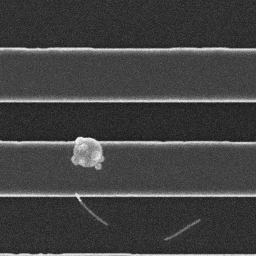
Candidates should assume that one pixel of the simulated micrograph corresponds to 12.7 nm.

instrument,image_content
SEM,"lines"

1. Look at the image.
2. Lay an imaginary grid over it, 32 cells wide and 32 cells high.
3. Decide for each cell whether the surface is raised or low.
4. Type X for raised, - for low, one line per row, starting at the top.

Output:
--------------------------------
--------------------------------
--------------------------------
--------------------------------
--------------------------------
--------------------------------
XXXXXXXXXXXXXXXXXXXXXXXXXXXXXXXX
XXXXXXXXXXXXXXXXXXXXXXXXXXXXXXXX
XXXXXXXXXXXXXXXXXXXXXXXXXXXXXXXX
XXXXXXXXXXXXXXXXXXXXXXXXXXXXXXXX
XXXXXXXXXXXXXXXXXXXXXXXXXXXXXXXX
XXXXXXXXXXXXXXXXXXXXXXXXXXXXXXXX
XXXXXXXXXXXXXXXXXXXXXXXXXXXXXXXX
--------------------------------
--------------------------------
--------------------------------
--------------------------------
---------XXX--------------------
XXXXXXXXXXXXXXXXXXXXXXXXXXXXXXXX
XXXXXXXXXXXXXXXXXXXXXXXXXXXXXXXX
XXXXXXXXXXXXXXXXXXXXXXXXXXXXXXXX
XXXXXXXXXXXXXXXXXXXXXXXXXXXXXXXX
XXXXXXXXXXXXXXXXXXXXXXXXXXXXXXXX
XXXXXXXXXXXXXXXXXXXXXXXXXXXXXXXX
XXXXXXXXXXXXXXXXXXXXXXXXXXXXXXXX
--------------------------------
--------------------------------
--------------------------------
--------------------------------
--------------------------------
--------------------------------
--------------------------------